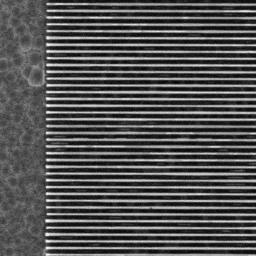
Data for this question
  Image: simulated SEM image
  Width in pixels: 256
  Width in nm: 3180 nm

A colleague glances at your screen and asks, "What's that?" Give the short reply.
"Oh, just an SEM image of parallel lines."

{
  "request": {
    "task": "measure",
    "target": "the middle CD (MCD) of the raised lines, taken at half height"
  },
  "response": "21.7 nm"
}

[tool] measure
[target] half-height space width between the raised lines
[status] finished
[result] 62.1 nm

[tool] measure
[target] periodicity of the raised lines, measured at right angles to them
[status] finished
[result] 84.3 nm